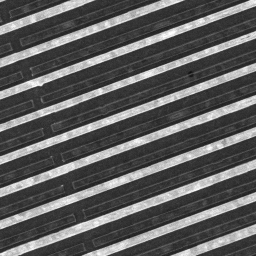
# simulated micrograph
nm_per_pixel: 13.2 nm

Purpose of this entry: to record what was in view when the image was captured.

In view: parallel lines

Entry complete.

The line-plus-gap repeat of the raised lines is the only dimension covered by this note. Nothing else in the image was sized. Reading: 200 nm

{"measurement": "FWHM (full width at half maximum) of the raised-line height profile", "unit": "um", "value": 0.102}